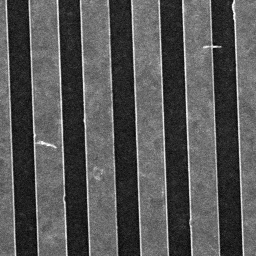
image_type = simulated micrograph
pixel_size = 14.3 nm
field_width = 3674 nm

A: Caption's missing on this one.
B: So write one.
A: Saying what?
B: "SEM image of parallel lines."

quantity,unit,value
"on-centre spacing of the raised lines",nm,732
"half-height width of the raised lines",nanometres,398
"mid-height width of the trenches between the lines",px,23.5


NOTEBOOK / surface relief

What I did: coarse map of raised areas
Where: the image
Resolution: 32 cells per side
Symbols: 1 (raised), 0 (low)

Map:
10001110001111000111000111000111
10001110001111000111000111000111
10001110001111000111000111000111
10001110001111000111000111000111
10001110001111000111000111000011
10001110001111000111000111100011
10001110001111000111000111000011
10001110001111000111000111000011
10001110001111000111000111100011
10001110001111000111000111100011
10001110000111000111000111100011
10001111000111000111000111100011
10001111000111000111000111100011
10001111000111000111000111100011
10001111000111000111000111100011
10001111000111000111000111100011
10001111000111000111000111100011
10001111000111000111000111100011
10001111000111000111000011100011
10001111000111000111100011100011
10001111000111000111100011100011
10000111000111000111100011100011
11000111000111000111100011100011
11001111000111000111100011100011
11000111000111000111100011100011
11000111000111000111100011100011
11000111000111000011100011100011
11000111000111100011100011100011
11000111000111100011100011100011
11000111000111100011100011100011
11000111000111100011100011100011
11000111000111100011100011100011